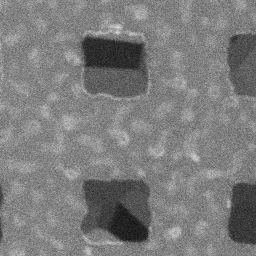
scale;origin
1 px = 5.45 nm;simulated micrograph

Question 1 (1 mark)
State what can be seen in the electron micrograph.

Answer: raised bodies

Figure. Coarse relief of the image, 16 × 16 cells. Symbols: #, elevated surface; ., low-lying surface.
................
................
.....####.....##
.....####.....##
.....####.....##
.....####.....##
................
................
................
................
................
.....####......#
.....####.....##
.....#####....##
.....####.....##
................